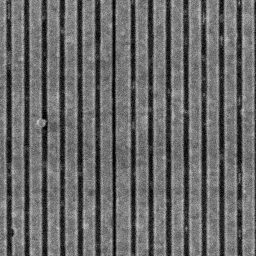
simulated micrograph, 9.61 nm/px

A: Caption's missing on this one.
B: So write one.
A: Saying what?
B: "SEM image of parallel lines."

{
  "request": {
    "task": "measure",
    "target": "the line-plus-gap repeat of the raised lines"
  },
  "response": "170 nanometers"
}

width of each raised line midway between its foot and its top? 104 nm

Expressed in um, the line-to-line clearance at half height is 0.0661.